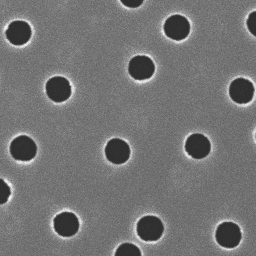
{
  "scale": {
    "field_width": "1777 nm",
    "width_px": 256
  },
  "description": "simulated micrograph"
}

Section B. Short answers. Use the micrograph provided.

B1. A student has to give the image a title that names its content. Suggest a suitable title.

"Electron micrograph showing a regular array of holes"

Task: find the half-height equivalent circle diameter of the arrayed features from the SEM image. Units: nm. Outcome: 182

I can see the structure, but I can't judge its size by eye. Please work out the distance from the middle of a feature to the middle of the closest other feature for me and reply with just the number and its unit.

490 nm